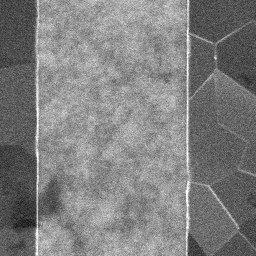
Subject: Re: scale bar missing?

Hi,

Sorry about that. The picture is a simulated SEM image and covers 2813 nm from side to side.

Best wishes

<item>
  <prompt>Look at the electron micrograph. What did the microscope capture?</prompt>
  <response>wiring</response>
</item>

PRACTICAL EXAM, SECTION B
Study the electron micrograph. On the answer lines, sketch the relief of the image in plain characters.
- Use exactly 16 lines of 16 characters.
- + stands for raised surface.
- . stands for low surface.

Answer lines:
++..........++++
++..........++++
++..........++++
++..........++++
++..........++++
++..........++++
++..........++++
++..........++++
++..........++++
++..........++++
++..........++++
++..........++++
++..........++++
++..........++++
++..........++++
++..........++++